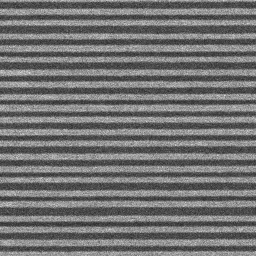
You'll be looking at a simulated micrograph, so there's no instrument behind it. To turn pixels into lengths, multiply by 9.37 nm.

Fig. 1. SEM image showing parallel lines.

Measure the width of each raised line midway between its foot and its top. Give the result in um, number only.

0.0433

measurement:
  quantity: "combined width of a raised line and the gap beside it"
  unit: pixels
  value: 12.1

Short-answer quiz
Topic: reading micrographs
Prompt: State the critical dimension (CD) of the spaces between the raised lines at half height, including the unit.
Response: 67.9 nm